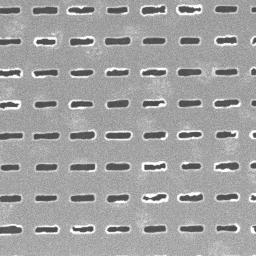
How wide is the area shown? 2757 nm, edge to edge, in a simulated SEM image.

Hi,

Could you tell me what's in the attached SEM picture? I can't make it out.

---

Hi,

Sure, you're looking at a regular array of holes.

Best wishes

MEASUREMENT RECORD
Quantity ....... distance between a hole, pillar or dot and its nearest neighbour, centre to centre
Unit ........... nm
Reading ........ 335